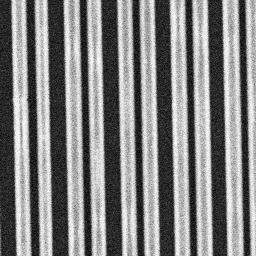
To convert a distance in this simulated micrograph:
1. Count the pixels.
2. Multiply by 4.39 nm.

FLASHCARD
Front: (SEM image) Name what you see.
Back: parallel lines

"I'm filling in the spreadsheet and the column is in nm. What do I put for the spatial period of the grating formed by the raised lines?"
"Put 116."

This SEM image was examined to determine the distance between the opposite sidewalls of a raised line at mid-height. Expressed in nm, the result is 50.5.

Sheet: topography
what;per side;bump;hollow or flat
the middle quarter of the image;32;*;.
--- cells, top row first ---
.***...**.....***...**.....***..
.***...**.....***...**.....***..
.***...**.....***...**.....***..
.***...**.....***...**.....***..
.***...**.....***...**.....***..
.***...**.....***...**.....***..
.***...**.....***...**.....***..
.***...**.....***...**.....***..
.***...**.....***...**......**..
.***...**.....***...**......**..
.***...**.....***...***.....**..
.***...**.....***...***.....**..
.***...**.....***...***.....**..
.***...**.....***...***.....**..
.***...**.....***...***.....**..
.***...**.....***...***.....**..
.***...**......**...***.....**..
.***...**......**...***.....**..
.***...**......**...***.....**..
.***...**......**...***.....**..
.***...**......**...***.....**..
.***...**......**...***.....**..
.***...**......**...***.....**..
.***...**......**...***.....**..
.***...**......**...***.....**..
.***...**......**...***.....**..
.***...**......**...***.....**..
.***...**......**...***.....**..
.***...**......**...***.....***.
.***...***.....**...***.....***.
.***...***.....**...***.....***.
.***...***.....**...***.....***.